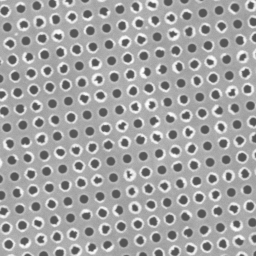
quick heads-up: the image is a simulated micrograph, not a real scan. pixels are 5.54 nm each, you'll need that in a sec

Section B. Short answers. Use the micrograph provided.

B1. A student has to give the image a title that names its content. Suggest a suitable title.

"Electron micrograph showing a regular array of holes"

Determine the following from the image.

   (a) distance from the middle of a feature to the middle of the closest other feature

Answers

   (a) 0.089 microns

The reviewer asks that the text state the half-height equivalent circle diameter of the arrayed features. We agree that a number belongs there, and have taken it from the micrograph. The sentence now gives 46 nm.